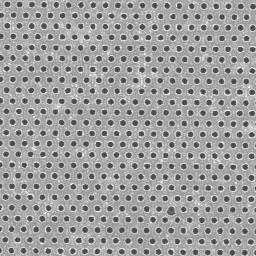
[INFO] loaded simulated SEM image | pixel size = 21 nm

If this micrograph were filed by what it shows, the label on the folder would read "a regular array of holes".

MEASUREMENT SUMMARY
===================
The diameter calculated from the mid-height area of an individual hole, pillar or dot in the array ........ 123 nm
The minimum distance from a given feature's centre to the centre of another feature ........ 252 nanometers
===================